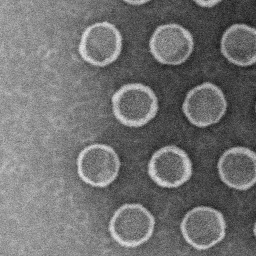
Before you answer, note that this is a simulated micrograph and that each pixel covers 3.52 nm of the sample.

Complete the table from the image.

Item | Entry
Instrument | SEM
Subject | a regular array of raised bodies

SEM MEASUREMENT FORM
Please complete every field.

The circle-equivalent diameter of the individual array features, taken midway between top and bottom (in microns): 0.141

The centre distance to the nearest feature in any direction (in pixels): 69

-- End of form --